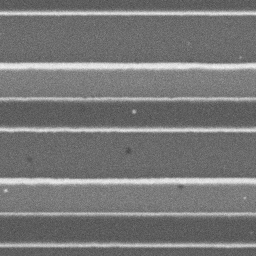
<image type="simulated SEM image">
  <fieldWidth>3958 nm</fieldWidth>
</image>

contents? lines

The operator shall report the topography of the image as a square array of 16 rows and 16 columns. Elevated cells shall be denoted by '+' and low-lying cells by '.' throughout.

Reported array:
++++++++++++++++
................
................
................
++++++++++++++++
++++++++++++++++
++++++++++++++++
++++++++++++++++
................
................
................
++++++++++++++++
++++++++++++++++
++++++++++++++++
++++++++++++++++
................